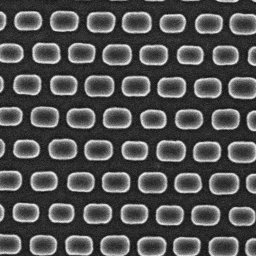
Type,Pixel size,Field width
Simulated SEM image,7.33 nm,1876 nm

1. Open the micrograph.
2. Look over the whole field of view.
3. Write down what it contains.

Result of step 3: a regular array of raised bodies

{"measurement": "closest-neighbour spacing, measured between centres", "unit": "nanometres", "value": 263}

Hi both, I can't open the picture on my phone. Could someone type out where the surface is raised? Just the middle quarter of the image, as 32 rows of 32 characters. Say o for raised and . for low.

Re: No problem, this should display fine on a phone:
................................
................................
................................
oo....oooooo.....oooo...........
ooo..ooooooo...oooooo...oooooo..
ooo..ooooooo...oooooo...oooooo..
ooo..ooooooo...oooooo...oooooo..
oo....oooooo...ooooo....oooooo..
................................
................................
................................
..ooooo....ooooo................
.oooooo...oooooo....ooooo...oooo
.oooooo...ooooooo..oooooo...oooo
.oooooo...ooooooo..oooooo...oooo
..ooooo...oooooo....ooooo...oooo
................................
................................
................................
ooo...ooooo.....ooo.....ooooo...
ooo..ooooooo...oooooo..ooooooo..
ooo..ooooooo...oooooo..ooooooo..
ooo..ooooooo...oooooo..ooooooo..
oo....ooooo....ooooo....oooooo..
................................
................................
................................
...oooo...ooooo.....ooooo.......
.oooooo...oooooo...oooooo...oooo
.oooooo...oooooo...oooooo...oooo
.oooooo...oooooo...ooooooo..oooo
..ooooo...oooooo...oooooo...oooo